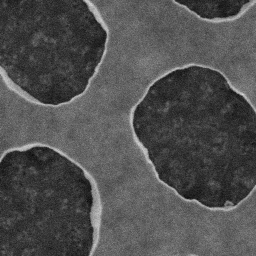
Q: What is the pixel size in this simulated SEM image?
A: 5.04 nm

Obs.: holes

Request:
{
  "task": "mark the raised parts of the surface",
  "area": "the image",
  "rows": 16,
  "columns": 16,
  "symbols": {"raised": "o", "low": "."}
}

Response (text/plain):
......oooooo...o
......oooooooooo
.......ooooooooo
......oooooooooo
......ooooo...oo
o....oooo.....oo
ooo.ooooo.......
oooooooo........
ooooooooo.......
o...ooooo.......
.....ooooo......
......oooo......
......oooooo...o
......oooooooooo
......oooooooooo
......oooooooooo